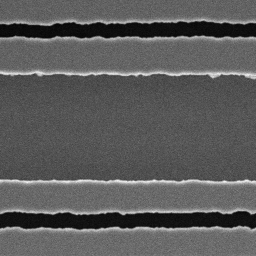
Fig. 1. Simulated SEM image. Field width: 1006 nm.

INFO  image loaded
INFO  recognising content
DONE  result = lines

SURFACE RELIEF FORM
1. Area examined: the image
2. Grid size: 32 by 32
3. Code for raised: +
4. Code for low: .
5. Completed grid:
++++++++++++++++++++++++++++++++
++++++++++++++++++++++++++++++++
++++++++++++++++++++++++++++++++
................................
................................
++++++++++++++++++++++++++++++++
++++++++++++++++++++++++++++++++
++++++++++++++++++++++++++++++++
++++++++++++++++++++++++++++++++
................................
................................
................................
................................
................................
................................
................................
................................
................................
................................
................................
................................
................................
................................
++++++++++++++++++++++++++++++++
++++++++++++++++++++++++++++++++
++++++++++++++++++++++++++++++++
+.++++++++++++++++++++++++.++..+
................................
.++..+........+..++....+++++.++.
++++++++++++++++++++++++++++++++
++++++++++++++++++++++++++++++++
++++++++++++++++++++++++++++++++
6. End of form